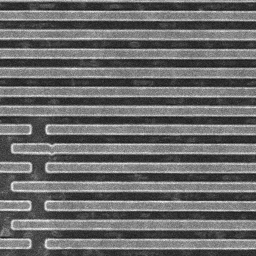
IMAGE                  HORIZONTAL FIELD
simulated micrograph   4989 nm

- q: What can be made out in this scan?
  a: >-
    parallel lines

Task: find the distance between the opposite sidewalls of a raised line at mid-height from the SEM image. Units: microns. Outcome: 0.183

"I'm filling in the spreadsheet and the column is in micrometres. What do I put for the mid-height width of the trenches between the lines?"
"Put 0.18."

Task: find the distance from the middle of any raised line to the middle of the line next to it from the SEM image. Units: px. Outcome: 19